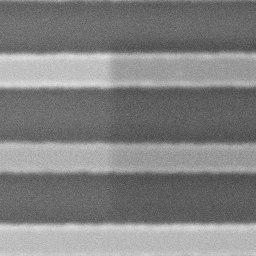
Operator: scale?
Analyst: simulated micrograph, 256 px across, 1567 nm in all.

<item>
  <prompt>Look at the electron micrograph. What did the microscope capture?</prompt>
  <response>lines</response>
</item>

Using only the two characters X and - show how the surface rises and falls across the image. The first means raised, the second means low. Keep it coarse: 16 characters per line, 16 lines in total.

----------------
----------------
----------------
-XXXXXXXXXXXXXXX
XXXXXXXXXXXXXXXX
----------------
----------------
----------------
----------------
XXXXXXXXXXXXXXXX
XXXXXXXXXXXXXXXX
----------------
----------------
----------------
XXXXXXXXXXXXXXXX
XXXXXXXXXXXXXXXX